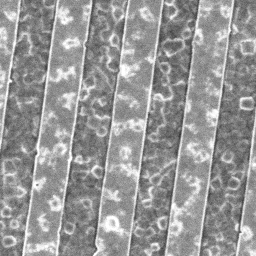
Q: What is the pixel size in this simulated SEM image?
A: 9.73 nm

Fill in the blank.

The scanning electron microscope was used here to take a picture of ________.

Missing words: one or a few lines or trenches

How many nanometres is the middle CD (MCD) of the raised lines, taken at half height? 323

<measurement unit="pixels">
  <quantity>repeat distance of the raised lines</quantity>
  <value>70.2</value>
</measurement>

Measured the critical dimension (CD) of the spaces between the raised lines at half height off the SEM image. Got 357 nanometers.